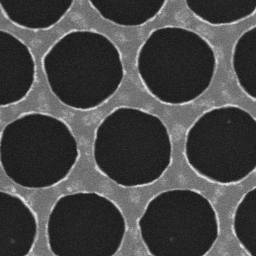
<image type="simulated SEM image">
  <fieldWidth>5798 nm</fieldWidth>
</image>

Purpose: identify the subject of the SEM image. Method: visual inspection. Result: holes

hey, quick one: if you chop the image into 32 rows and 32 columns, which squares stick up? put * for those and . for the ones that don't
.........**.........***.........
*.......****........****........
*......*******....********....**
****..***************..*********
..******.....******......*****..
...****.......****........***...
....**.........**..........**...
....*..........**..........**...
....**.........**..........**...
....**.........***.........***..
....**.........***........****..
...****.......*****......******.
..******.....*******....********
*********...***.***********...**
***...*******......******......*
*.......*****.......****........
.........***.........***........
.........***.........**.........
..........**.........**.........
..........**.........**.........
.........***.........***........
*........****.......*****......*
*.......******.....*******....**
****.***************************
..******.....*******.....******.
...****.......*****.......****..
....**.........***.........**...
....**..........*..........**...
.....*..........*..........**...
.....*.........***.........***..
....**.........***.........***..
....***........****.......*****.